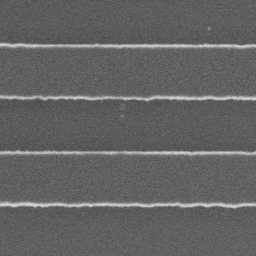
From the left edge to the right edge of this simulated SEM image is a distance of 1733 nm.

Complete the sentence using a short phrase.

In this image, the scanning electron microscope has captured lines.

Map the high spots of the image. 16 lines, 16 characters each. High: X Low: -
----------------
----------------
----------------
XXXXXXXXXXXXXXXX
XXXXXXXXXXXXXXXX
XXXXXXXXXXXXXXXX
----------------
----------------
----------------
----------------
XXXXXXXXXXXXXXXX
XXXXXXXXXXXXXXXX
XXXXXXXXXXXXXXXX
----------------
----------------
----------------